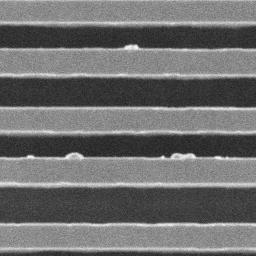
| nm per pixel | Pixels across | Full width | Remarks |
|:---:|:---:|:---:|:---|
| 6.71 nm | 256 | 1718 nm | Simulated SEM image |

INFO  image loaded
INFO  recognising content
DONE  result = lines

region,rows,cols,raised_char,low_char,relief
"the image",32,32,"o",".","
oooooooooooooooooooooooooooooooo
oooooooooooooooooooooooooooooooo
oooooooooooooooooooooooooooooooo
................................
................................
................................
oooooooooooooooooooooooooooooooo
oooooooooooooooooooooooooooooooo
oooooooooooooooooooooooooooooooo
................................
................................
................................
................................
o............oo.o...............
oooooooooooooooooooooooooooooooo
oooooooooooooooooooooooooooooooo
oooooooooooooooooooooooooooooooo
................................
................................
........oo...........ooo........
oooooooooooooooooooooooooooooooo
oooooooooooooooooooooooooooooooo
oooooooooooooooooooooooooooooooo
................................
................................
................................
................................
................................
oooooooooooooooooooooooooooooooo
oooooooooooooooooooooooooooooooo
oooooooooooooooooooooooooooooooo
................................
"